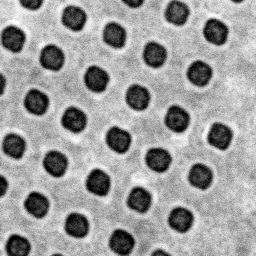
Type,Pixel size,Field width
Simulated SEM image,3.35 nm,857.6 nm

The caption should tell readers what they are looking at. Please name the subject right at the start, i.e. a regular array of holes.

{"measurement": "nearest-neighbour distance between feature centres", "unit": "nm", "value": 150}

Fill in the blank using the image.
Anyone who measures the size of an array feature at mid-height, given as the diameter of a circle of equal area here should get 0.0918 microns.